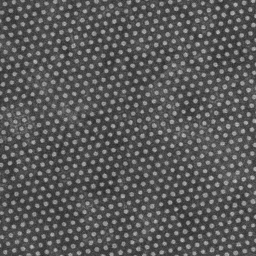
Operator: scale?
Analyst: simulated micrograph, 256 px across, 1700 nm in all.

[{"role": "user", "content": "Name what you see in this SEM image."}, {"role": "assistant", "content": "a regular array of raised bodies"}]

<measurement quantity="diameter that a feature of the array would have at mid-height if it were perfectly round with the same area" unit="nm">27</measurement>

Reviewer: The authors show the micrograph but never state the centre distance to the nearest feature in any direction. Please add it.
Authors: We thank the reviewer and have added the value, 57.9 nanometers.